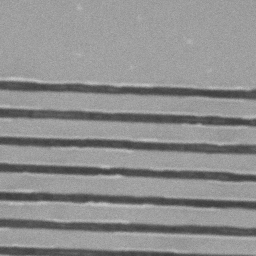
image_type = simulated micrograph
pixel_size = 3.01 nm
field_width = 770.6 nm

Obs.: parallel lines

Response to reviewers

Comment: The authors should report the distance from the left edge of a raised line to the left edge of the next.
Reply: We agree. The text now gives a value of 82.9 nm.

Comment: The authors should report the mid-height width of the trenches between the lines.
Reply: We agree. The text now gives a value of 8.74 px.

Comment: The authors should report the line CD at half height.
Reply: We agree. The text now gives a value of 57.2 nm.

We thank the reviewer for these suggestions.